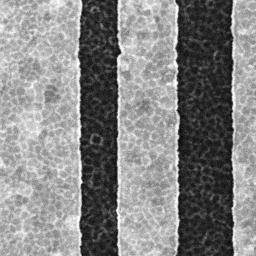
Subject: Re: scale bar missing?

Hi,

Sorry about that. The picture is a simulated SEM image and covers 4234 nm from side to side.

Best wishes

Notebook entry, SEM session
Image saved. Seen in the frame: one or a few lines or trenches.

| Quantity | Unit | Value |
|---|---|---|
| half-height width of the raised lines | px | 58.6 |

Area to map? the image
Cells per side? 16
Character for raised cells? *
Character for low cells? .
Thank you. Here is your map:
*****..****....*
*****..****....*
*****..****....*
*****..****....*
*****..****....*
*****..****....*
*****..****....*
*****..****....*
*****..****....*
*****..****....*
*****..****....*
*****..****....*
*****..****....*
*****..****....*
*****..****....*
*****..****....*